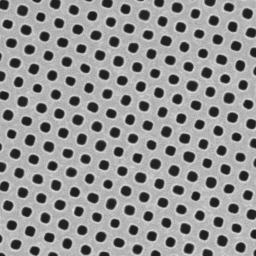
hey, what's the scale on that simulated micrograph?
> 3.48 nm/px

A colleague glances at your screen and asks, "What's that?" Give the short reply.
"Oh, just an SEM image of a regular array of holes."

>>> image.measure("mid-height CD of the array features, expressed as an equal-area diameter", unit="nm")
34.2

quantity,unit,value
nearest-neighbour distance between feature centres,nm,67